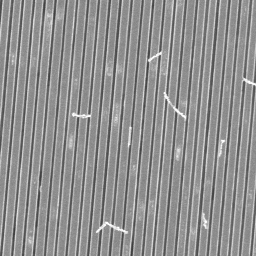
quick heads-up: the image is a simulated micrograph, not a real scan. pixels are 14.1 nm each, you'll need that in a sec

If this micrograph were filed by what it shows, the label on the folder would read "parallel lines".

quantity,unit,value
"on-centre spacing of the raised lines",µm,0.152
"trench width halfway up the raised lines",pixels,2.87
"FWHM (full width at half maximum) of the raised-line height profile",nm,110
